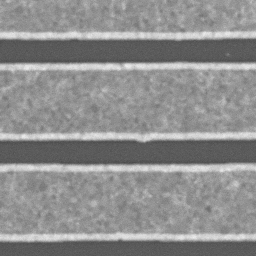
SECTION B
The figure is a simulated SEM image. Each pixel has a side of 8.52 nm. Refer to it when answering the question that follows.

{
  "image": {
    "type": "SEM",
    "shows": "one or a few lines or trenches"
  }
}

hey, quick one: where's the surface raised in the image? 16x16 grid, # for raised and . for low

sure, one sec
################
################
................
................
################
################
################
################
##########......
................
##..............
################
################
################
################
................